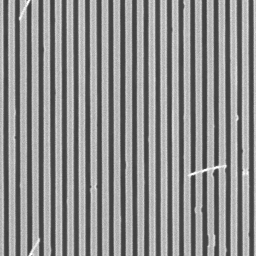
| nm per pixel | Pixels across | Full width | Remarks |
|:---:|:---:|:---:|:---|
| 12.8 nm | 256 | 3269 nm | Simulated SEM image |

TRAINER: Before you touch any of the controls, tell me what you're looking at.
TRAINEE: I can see parallel lines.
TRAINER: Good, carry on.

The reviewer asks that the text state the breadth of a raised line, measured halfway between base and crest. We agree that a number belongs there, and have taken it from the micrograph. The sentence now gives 6.88 px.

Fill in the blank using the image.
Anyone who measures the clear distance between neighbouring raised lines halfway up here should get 62.3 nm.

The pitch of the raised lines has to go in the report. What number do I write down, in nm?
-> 149